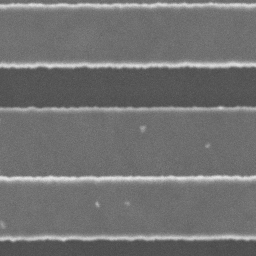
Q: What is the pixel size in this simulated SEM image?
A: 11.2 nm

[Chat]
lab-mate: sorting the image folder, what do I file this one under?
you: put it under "lines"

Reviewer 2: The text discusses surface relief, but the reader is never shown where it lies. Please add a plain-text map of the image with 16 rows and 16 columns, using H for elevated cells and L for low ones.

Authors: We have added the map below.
HHHHHHHHHHHHHHHH
HHHHHHHHHHHHHHHH
HHHHHHHHHHHHHHHH
HHHHHHHHHHHHHHHH
LLLLLLLLLLLLLLLL
LLLLLLLLLLLLLLLL
LLLLLLLLLLLLLLLL
HHHHHHHHHHHHHHHH
HHHHHHHHHHHHHHHH
HHHHHHHHHHHHHHHH
HHHHHHHHHHHHHHHH
HHHHHHHHHHHHHHHH
HHHHHHHHHHHHHHHH
HHHHHHHHHHHHHHHH
HHHHHHHHHHHHHHHH
LLLLLLLLLLLLLLLL